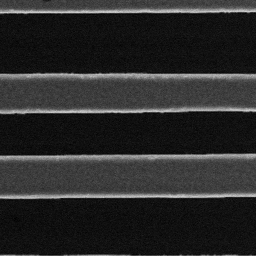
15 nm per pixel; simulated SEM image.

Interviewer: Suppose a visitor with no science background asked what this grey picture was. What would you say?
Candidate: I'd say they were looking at lines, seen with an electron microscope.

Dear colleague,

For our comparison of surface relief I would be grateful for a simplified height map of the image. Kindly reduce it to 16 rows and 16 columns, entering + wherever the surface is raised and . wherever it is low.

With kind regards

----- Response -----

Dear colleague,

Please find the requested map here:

++++++++++++++++
................
................
................
................
++++++++++++++++
++++++++++++++++
................
................
................
++++++++++++++++
++++++++++++++++
................
................
................
................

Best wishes